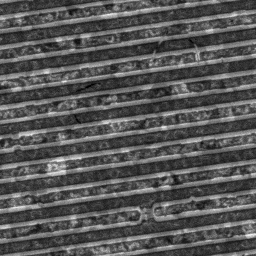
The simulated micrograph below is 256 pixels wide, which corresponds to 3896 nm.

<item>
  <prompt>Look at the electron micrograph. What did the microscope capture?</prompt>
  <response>parallel lines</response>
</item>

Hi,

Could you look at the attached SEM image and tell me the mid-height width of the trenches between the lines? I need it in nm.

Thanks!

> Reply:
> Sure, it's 232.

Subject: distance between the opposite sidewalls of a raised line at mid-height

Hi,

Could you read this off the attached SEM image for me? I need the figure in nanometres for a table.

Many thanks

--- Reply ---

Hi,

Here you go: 217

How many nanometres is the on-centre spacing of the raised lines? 452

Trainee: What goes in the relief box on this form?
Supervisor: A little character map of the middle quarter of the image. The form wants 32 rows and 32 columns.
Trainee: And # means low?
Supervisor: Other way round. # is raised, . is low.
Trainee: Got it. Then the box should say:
.....########################...
######################..........
###############.................
########........................
#............................###
......................##########
...............#################
........########################
.##########################.....
##################..............
###########.....................
####............................
.........................#######
..................##############
...........#####################
....#########################...
#####################...........
##############..................
#######.........................
............................####
.....................###########
................################
.......#########################
#########################.......
##################..............
###########.....................
###.............................
.........................#######
...................#############
............####################
.....########################...
######################..........